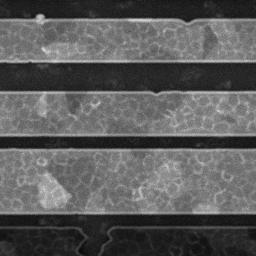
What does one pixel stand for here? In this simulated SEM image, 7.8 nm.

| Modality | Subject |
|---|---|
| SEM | one or a few lines or trenches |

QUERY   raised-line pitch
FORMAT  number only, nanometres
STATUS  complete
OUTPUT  547